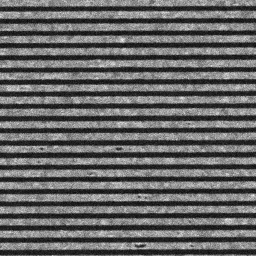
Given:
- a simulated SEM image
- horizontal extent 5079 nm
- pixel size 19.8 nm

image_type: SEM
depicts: parallel lines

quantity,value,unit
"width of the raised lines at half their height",126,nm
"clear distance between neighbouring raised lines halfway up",0.107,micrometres